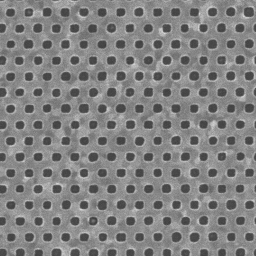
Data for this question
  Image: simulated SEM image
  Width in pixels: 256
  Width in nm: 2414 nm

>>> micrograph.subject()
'a regular array of holes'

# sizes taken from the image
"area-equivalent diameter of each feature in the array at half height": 89.7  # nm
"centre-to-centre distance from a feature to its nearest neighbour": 0.171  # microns